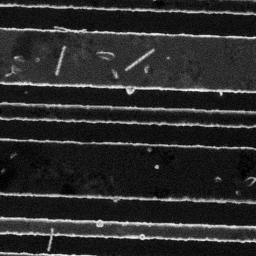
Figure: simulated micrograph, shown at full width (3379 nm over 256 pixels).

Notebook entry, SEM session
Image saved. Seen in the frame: lines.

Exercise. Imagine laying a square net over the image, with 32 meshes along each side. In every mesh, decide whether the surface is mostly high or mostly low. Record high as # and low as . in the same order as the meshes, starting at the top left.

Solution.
################################
.....................###########
................................
................................
#########################.......
################################
################################
################################
################################
################################
.###############################
...............................#
................................
###############.................
################################
.....................###########
................................
##..............................
################################
################################
################################
################################
################################
################################
........########################
................................
................................
####............................
################################
......#...######################
................................
................................